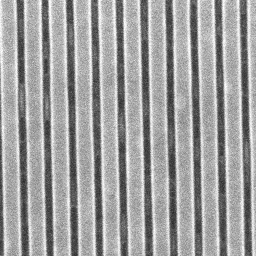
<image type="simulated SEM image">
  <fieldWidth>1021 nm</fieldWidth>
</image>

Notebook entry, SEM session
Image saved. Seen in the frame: parallel lines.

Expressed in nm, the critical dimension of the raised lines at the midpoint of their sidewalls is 63.9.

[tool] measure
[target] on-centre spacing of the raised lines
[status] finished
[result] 0.099 um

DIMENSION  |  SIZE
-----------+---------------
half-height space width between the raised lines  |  0.0334 microns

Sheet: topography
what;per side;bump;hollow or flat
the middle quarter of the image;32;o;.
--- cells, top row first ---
o..oooo..oooo..oooo...ooo...oooo
...oooo..oooo..oooo...ooo...oooo
...oooo..oooo..oooo...ooo...oooo
...oooo..oooo..oooo...ooo...oooo
o..oooo..oooo..oooo...ooo...oooo
o..oooo..oooo..oooo...ooo...oooo
o..oooo..oooo..oooo...ooo...oooo
o..oooo..oooo..oooo...ooo...oooo
o..oooo..oooo..oooo...oooo..oooo
o..oooo..oooo..oooo...oooo..oooo
o..oooo..oooo..oooo...oooo..oooo
o..oooo..oooo...ooo...oooo..oooo
o..oooo..oooo...ooo...oooo..oooo
o..oooo..oooo...ooo...oooo..oooo
o..oooo..oooo...ooo...oooo..oooo
o..oooo...ooo...oooo..oooo..oooo
o..oooo...ooo...oooo..oooo..oooo
o..oooo...ooo...oooo..oooo..oooo
o..oooo...ooo...oooo..oooo..oooo
o..oooo...ooo...oooo..oooo..oooo
o..oooo...ooo...oooo..oooo..oooo
o..oooo...ooo...oooo..oooo..oooo
o..oooo...ooo...oooo..oooo..oooo
o..oooo...ooo...oooo..oooo..oooo
o..oooo...ooo...oooo..oooo..oooo
o..oooo...ooo...oooo..oooo..oooo
o..oooo...ooo...oooo..oooo..oooo
o..oooo...oooo..oooo..oooo..oooo
o..oooo...oooo..oooo..oooo..oooo
o..oooo...oooo..oooo..oooo..oooo
o...ooo...oooo..oooo..oooo..oooo
o...oooo..oooo..oooo..oooo..oooo